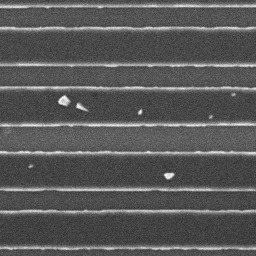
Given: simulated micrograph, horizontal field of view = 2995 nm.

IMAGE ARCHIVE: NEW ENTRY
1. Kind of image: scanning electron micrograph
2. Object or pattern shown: lines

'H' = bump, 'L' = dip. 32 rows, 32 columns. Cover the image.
HHHHHHHHHHHHHHHHHHHHHHHHHHHHHHHH
LLLLLLLLLLLLLLLLLLLLLLLLLLLLLLLL
LLLLLLLLLLLLLLLLLLLLLLLLLLLLLLLL
HHLLLHHHLHHHHHHHHLHHHHHHHHLHHHLH
HHHHHHHHHHHHHHHHHHHHHHHHHHHHHHHH
HHHHHHHHHHHHHHHHHHHHHHHHHHHHHHHH
HHHHHHHHHHHHHHHHHHHHHHHHHHHHHHHH
HHHHHHHHHHHHHHHHHHHHHHHHHHHHHHHH
LLLLLLLLLLLLLLLLLLLLLLLLLLLLLLLL
LLLLLLLLLLLLLLLLLLLLLLLLLLLLLLLL
LLLLLLLLLLLLLLLLLLLLLLLLLLLLLLLL
HHHHHHHHHHHHHHHHHHHHHHHHHHHHHHHH
HHHHHHHHHHHHHHHHHHHHHHHHHHHHHHHH
HHHHHHHHHHHHHHHHHHHHHHHHHHHHHHHH
HHHHHHHHHHHHHHHHHHHHHHHHHHHHHHHH
HHHHHHHHHHHHHHHHHHHHHHHHHHHHHHHH
LLLLLLLLLLLLLLLLLLLLLLLLLLLLLLLL
LLLLLLLLLLLLLLLLLLLLLLLLLLLLLLLL
LLLLLLLLLLLLLLLLLLLLLLLLLLLLLLLL
HHHHHHHHHHHHHHHHHHHHHHHHHHHHHHHH
HHHHHHHHHHHHHHHHHHHHHHHHHHHHHHHH
HHHHHHHHHHHHHHHHHHHHHHHHHHHHHHHH
HHHHHHHHHHHHHHHHHHHHHHHHHHHHHHHH
HHHHHHHHHHHHHHHHHHHHHHHHHHHHHHHH
LLLLLLLLLLLLLLLLLLLLLLLLLLLLLLLL
LLLLLLLLLLLLLLLLLLLLLLLLLLLLLLLL
HHHHHHHHHHHHHHHHHHHHHHHHHHHHHHHH
HHHHHHHHHHHHHHHHHHHHHHHHHHHHHHHH
HHHHHHHHHHHHHHHHHHHHHHHHHHHHHHHH
HHHHHHHHHHHHHHHHHHHHHHHHHHHHHHHH
HHHHHHHHHHHHHHHHHHHHHHHHHHHHHHHH
LLLLLLLLLLLLLLLLLLLLLLLLLLLLLLLL